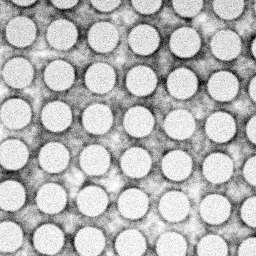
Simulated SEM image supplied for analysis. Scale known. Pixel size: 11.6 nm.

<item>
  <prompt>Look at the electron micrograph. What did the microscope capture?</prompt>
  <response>an array of small figures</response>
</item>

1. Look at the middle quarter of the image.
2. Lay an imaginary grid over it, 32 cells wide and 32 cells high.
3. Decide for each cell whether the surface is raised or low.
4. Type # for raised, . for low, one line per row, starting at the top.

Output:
##.....####.....................
##....######.....#####......###.
###...#######...#######....#####
###..########...#######...######
##....#######...#######...######
##....######....#######...######
.......####.....######....######
..................###......#####
............................###.
................................
#......###......................
#.....#####.....#####........#..
##...#######...#######....#####.
##...#######...#######....######
##...#######...#######...#######
#....#######...#######...#######
......#####....#######...#######
................#####.....######
...........................####.
................................
.......##.......................
#....#####......####............
#...#######....######.....#####.
#...#######...########...######.
#...#######...########...#######
....#######...########...#######
.....######....######....#######
......###.......####.....######.
..........................####..
................................
................................
.....#####......###.............